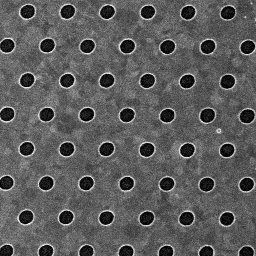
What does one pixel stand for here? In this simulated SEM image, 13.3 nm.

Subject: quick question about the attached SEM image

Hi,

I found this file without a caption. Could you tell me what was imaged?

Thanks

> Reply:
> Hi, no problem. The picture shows a regular array of holes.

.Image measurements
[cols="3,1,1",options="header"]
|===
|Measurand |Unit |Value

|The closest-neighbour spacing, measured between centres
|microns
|0.525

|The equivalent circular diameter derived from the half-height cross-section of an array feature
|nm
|195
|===